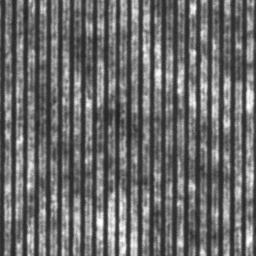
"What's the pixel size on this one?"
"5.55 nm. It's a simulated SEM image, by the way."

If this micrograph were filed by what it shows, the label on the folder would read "parallel lines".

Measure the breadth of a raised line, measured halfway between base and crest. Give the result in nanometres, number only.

27.1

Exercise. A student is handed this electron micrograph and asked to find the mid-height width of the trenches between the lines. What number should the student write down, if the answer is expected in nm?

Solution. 38.2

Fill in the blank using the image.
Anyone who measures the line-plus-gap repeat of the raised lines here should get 63.9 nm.